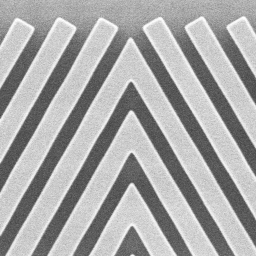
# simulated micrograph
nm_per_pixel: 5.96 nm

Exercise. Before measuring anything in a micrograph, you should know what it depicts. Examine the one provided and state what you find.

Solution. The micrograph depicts groups of lines, slits or small figures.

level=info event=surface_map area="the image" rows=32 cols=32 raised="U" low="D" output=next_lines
DDDDDDDDDDDDDDDDDDDDDDDDDDDDDDDD
DDDDDDDDDDDDDDDDDDDDDDDDDDDDDDDD
DDDDDDDUDDDDUDDDDDDUDDDDDUDDDDUD
DUUUDDUUUDDDUUUDDDUUUDDUUUDDUUUD
DUUUDDUUUDDUUUDDDDUUUUDDUUUDDUUU
UUUDDUUUDDDUUUDDUDDUUUDDUUUDDDUU
UUUDDUUUDDUUUDDUUDDDUUUDDUUUDDUU
UUDDUUUDDUUUUDDUUUDDUUUDDUUUUDDU
UDDDUUUDDUUUDDUUUUUDDUUUDDUUUDDU
UDDUUUDDUUUDDUUUUUUDDUUUDDDUUUDD
DDDUUUDDUUUDDUUUDUUUDDUUUDDUUUDD
DDUUUDDUUUDDUUUDDUUUDDDUUUDDUUUD
DUUUUDDUUUDDUUUDDDUUUDDUUUDDUUUU
DUUUDDUUUDDUUUDDDDDUUUDDUUUDDUUU
UUUDDUUUUDDUUUDDUDDUUUDDUUUDDDUU
UUUDDUUUDDUUUDDUUUDDUUUDDUUUDDUU
UUDDUUUDDDUUUDDUUUDDUUUDDDUUUDDU
UUDDUUUDDUUUDDUUUUUDDUUUDDUUUDDU
UDDUUUDDUUUDDDUUUUUDDDUUUDDUUUDD
UDDUUUDDUUUDDUUUDUUUDDUUUDDUUUDD
DDUUUDDUUUDDUUUDDUUUDDDUUUDDUUUD
DUUUUDDUUUDDUUUDDDUUUDDUUUDDUUUU
DUUUDDUUUDDUUUDDDDDUUUDDUUUDDUUU
UUUDDDUUUDDUUUDDUDDUUUDDUUUDDDUU
UUUDDUUUDDUUUDDUUUDDUUUDDUUUDDUU
UUDDUUUUDDUUUDDUUUDDUUUDDDUUUDDU
UUDDUUUDDUUUDDUUUUUDDUUUDDUUUDDU
UDDUUUDDUUUUDDUUUUUDDDUUUDDUUUDD
UDDUUUDDUUUDDUUUDUUUDDUUUDDUUUDD
DDUUUDDUUUDDDUUUDUUUUDDUUUDDUUUD
DDUUUDDUUUDDUUUDDDUUUDDUUUDDDUUU
DUUUDDUUUDDUUUUDDDDUUUDDUUUDDUUU